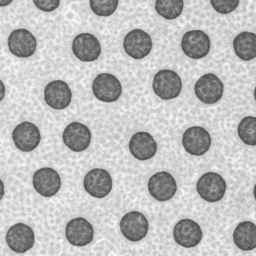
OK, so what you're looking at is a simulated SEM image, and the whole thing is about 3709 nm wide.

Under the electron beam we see a regular array of holes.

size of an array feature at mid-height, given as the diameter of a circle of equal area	430	nm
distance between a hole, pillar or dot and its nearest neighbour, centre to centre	704	nm